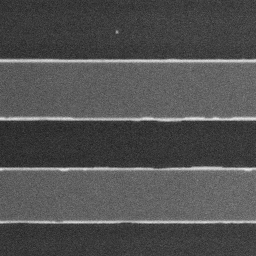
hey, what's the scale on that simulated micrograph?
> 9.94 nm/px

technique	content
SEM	lines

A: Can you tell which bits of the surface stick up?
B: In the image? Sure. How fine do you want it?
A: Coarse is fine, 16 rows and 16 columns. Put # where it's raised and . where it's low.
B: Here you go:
................
................
................
................
################
################
################
................
................
................
................
################
################
################
................
................